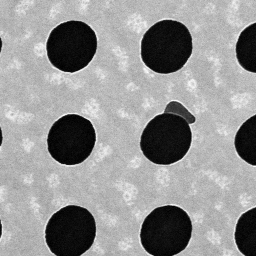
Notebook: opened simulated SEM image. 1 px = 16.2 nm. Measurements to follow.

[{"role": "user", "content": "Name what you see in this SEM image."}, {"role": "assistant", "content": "holes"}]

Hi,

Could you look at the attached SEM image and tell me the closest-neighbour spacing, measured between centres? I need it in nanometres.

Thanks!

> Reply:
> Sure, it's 1480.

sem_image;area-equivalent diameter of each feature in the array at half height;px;52.3